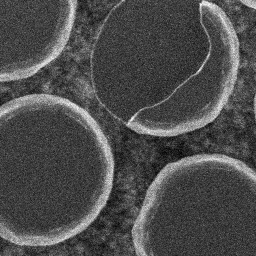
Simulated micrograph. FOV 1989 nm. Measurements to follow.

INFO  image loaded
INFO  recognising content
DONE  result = raised bodies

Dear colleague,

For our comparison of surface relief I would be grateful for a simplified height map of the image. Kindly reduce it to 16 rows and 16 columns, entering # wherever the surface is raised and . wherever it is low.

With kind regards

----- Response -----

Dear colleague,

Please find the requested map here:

####............
####.........#..
####.........##.
###..........##.
##..........###.
...........###..
.###......####..
######..#####...
######..........
#######.........
#######....####.
#######...######
######...#######
######...#######
#####....#######
.........#######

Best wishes